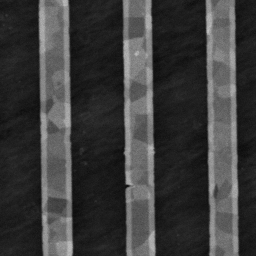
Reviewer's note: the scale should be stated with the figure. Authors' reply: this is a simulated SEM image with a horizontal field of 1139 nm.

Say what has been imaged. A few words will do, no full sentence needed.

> one or a few lines or trenches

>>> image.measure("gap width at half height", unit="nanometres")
267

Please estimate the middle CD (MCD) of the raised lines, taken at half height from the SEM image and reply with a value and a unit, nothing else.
102 nm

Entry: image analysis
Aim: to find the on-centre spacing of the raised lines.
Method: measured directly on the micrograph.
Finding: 83.3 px